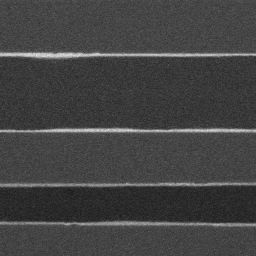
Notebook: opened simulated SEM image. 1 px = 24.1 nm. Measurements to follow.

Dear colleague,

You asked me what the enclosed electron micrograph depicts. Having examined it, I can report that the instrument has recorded lines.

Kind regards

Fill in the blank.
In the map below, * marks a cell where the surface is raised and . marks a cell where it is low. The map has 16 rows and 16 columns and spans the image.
****************
****************
****************
................
................
................
................
................
****************
****************
****************
**************..
................
................
****************
****************